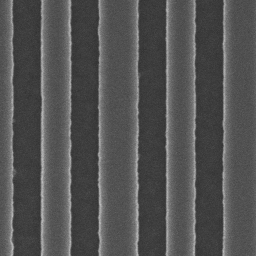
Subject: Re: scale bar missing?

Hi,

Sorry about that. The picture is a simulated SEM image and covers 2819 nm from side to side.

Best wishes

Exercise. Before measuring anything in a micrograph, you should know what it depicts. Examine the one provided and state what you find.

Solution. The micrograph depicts lines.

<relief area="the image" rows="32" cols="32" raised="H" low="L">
HHLLLHHHHLLLHHHHHLLLLHHHLLLLHHHH
HLLLLHHHHLLLHHHHHLLLLHHHLLLLHHHH
HHLLLHHHHLLLHHHHHLLLLHHHLLLLHHHH
HHLLLHHHHLLLHHHHHLLLLHHHLLLLHHHH
HHLLLHHHHLLLHHHHHLLLLHHHLLLLHHHH
HHLLLHHHHLLLHHHHHLLLLHHHLLLLHHHH
HHLLLHHHHLLLHHHHHLLLLHHHLLLLHHHH
HHLLLHHHHLLLHHHHHLLLLHHHLLLLHHHH
HHLLLHHHHLLLHHHHHLLLLHHHLLLLHHHH
HHLLLHHHHLLLHHHHHLLLLHHHLLLLHHHH
HHLLLHHHHLLLHHHHHLLLLHHHLLLLHHHH
HHLLLHHHHLLLHHHHHLLLLHHHLLLLHHHH
HHLLLHHHHLLLHHHHHLLLLHHHLLLLHHHH
HHLLLHHHHLLLHHHHHLLLLHHHLLLLHHHH
HHLLLHHHHLLLHHHHHLLLLHHHLLLLHHHH
HLLLLHHHHLLLHHHHHLLLLHHHLLLLHHHH
HHLLLHHHHLLLHHHHHLLLLHHHLLLLHHHH
HLLLLHHHHLLLHHHHHLLLLHHHLLLLHHHH
HLLLLHHHHLLLHHHHHLLLLHHHLLLLHHHH
HHLLLHHHHLLLHHHHHLLLLHHHLLLLHHHH
HHLLLHHHHLLLHHHHHLLLLHHHLLLLHHHH
HHLLLHHHHLLLHHHHHLLLLHHHLLLLHHHH
HHLLLHHHHLLLHHHHHLLLLHHHLLLLHHHH
HHLLLHHHHLLLHHHHHLLLLHHHLLLLHHHH
HHLLLHHHHLLLHHHHHLLLLHHHLLLLHHHH
HHLLLHHHHLLLHHHHHLLLLHHHLLLLHHHH
HHLLLHHHHLLLHHHHHLLLLHHHLLLLHHHH
HHLLLHHHHLLLHHHHHLLLLHHHLLLLHHHH
HHLLLHHHHLLLHHHHHLLLLHHHLLLLHHHH
HLLLLHHHHLLLHHHHHLLLLHHHLLLLHHHH
HHLLLHHHHLLLHHHHHLLLLHHHLLLLHHHH
HHLLLHHHHLLLHHHHHLLLLHHHLLLLHHHH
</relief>